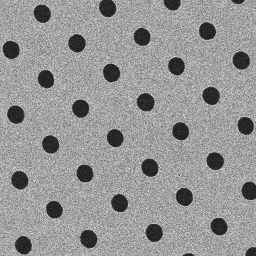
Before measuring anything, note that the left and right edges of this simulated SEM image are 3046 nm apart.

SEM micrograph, a regular array of holes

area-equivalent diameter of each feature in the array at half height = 209 nanometres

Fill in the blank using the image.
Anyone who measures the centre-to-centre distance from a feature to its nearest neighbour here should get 540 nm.